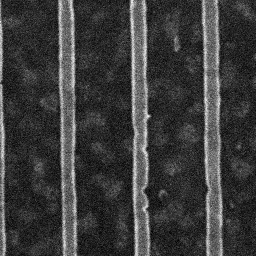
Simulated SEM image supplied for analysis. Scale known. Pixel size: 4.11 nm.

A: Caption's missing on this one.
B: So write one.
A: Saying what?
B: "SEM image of one or a few lines or trenches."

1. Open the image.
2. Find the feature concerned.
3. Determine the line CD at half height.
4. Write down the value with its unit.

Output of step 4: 0.0519 um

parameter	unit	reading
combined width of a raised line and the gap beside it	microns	0.297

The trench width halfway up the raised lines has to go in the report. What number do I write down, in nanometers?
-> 244